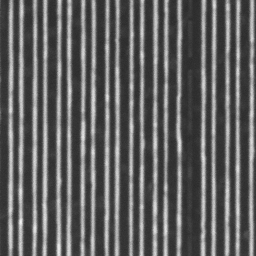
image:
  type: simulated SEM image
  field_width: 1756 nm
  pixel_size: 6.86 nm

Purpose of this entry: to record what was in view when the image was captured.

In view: parallel lines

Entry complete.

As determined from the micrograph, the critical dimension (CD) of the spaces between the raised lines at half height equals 60.1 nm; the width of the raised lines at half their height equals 19.7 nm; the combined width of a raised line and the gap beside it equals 82.6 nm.